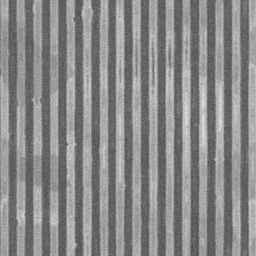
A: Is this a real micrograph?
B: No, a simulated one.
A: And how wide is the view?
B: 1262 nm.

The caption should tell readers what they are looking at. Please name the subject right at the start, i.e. parallel lines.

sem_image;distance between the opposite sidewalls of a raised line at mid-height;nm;33.9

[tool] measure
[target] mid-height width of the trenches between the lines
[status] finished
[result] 48.7 nm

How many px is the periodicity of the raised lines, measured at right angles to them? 16.5